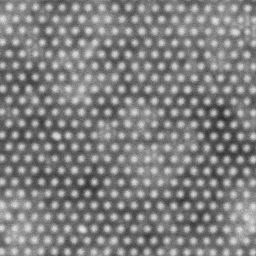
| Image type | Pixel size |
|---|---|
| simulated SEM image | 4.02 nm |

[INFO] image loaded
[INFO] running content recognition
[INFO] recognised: a regular array of raised bodies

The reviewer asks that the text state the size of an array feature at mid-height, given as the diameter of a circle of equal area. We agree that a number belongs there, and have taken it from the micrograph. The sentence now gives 0.0257 micrometres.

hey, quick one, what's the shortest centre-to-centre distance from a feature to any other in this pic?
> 51.9 nm